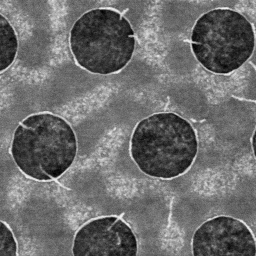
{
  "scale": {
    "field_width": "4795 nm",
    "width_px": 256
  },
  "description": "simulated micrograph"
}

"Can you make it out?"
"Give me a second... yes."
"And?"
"holes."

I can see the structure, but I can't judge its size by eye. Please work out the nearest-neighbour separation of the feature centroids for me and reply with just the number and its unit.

120 px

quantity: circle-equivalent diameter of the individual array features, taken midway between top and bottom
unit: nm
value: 1220